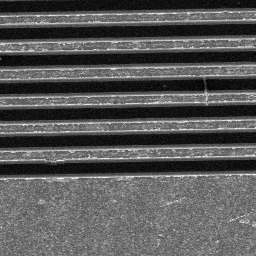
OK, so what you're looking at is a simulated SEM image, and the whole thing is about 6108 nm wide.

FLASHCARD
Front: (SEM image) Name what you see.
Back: parallel lines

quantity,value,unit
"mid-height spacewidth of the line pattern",379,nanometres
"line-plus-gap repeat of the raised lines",27.1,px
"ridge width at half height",0.262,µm